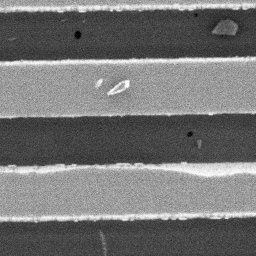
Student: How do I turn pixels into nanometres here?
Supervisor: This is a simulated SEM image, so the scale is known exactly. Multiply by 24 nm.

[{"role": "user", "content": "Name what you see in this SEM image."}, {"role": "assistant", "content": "lines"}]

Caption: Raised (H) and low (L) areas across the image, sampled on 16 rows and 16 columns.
HHHHHHHLLLLLLLLL
LLLLLLLLLLLLLLLL
LLLLLLLLLLLLLLLL
LLLLLLLLLLLLLLLL
HHHHHHHHHHHHHHHH
HHHHHHHHHHHHHHHH
HHHHHHHHHHHHHHHH
LLLLLLLLLLLLLLLL
LLLLLLLLLLLLLLLL
LLLLLLLLLLLLLLLL
LLLLHHHHHHHHLLLH
HHHHHHHHHHHHHHHH
HHHHHHHHHHHHHHHH
HHHHHHHHHHHHHLLL
LLLLLLLLLLLLLLLL
LLLLLLLLLLLLLLLL